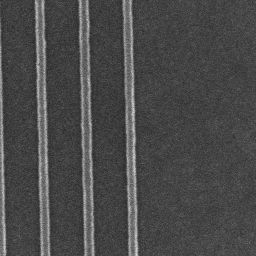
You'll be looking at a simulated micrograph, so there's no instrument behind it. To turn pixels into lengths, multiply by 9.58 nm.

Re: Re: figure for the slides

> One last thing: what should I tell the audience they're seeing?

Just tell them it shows parallel lines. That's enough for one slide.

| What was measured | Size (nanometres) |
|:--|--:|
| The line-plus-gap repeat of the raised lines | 421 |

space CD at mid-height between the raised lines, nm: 342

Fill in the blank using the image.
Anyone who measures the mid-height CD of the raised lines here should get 74.2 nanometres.